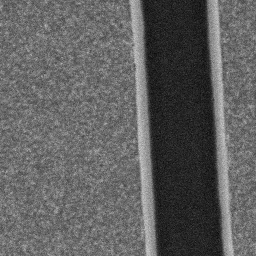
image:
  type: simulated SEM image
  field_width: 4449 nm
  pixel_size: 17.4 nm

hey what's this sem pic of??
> one or a few lines or trenches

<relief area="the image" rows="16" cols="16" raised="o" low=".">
ooooooooo....ooo
ooooooooo....ooo
ooooooooo....ooo
ooooooooo....ooo
ooooooooo.....oo
ooooooooo.....oo
ooooooooo.....oo
ooooooooo.....oo
ooooooooo.....oo
ooooooooo.....oo
ooooooooo.....oo
ooooooooo.....oo
ooooooooo.....oo
ooooooooo.....oo
ooooooooo.....oo
oooooooooo....oo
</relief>